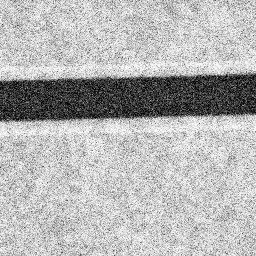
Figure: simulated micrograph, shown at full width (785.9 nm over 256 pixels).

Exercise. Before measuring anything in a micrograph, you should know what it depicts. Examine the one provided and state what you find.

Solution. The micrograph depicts one or a few lines or trenches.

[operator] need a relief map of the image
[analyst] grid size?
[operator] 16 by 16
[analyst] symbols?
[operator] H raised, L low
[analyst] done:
HHHHHHHHHHHHHHHH
HHHHHHHHHHHHHHHH
HHHHHHHHHHHHHHHH
HHHHHHHHHHHHHHHH
HHHHHHHHLLLLLLLL
LLLLLLLLLLLLLLLL
LLLLLLLLLLLLLLLL
LLLLLLLLLLLLLLLL
HHHHHHHHHHHHHHHH
HHHHHHHHHHHHHHHH
HHHHHHHHHHHHHHHH
HHHHHHHHHHHHHHHH
HHHHHHHHHHHHHHHH
HHHHHHHHHHHHHHHH
HHHHHHHHHHHHHHHH
HHHHHHHHHHHHHHHH